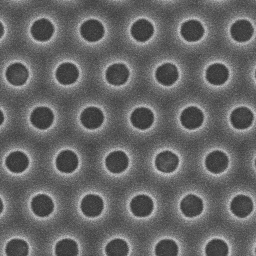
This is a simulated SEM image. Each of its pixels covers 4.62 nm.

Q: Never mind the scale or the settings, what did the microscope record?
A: a regular array of holes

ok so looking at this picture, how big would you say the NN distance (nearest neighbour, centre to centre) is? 230 nm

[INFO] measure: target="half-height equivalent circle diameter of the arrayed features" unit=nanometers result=113